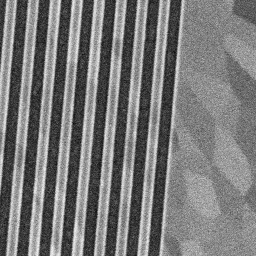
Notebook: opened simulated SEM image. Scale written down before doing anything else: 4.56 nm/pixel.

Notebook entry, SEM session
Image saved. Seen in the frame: parallel lines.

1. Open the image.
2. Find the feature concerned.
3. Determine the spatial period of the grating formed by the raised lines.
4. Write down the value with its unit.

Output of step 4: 0.0993 microns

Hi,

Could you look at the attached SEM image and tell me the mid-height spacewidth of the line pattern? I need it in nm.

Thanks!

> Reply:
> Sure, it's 56.2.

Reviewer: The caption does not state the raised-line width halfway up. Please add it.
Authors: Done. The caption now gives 43.1 nm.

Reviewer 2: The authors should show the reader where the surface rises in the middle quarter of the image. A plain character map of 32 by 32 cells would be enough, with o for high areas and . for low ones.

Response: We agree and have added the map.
.oo...ooo...oo...oo....oo...oooo
.oo...oo....oo...oo....oo...oooo
.oo...oo....oo...oo....oo...oooo
.oo...oo....oo...oo....oo...oooo
ooo...oo...ooo...oo...oo....oooo
ooo...oo...ooo...oo...oo....oooo
ooo...oo...ooo...oo...oo....oooo
oo....oo...oo....oo...oo....oooo
oo....oo...oo....oo...oo....oooo
oo....oo...oo....o....oo....oooo
oo...ooo...oo...oo....oo...ooooo
oo...ooo...oo...oo....oo...ooooo
oo...oo....oo...oo....oo...ooooo
oo...oo....oo...oo....oo...ooooo
oo...oo....oo...oo....oo...ooooo
oo...oo....oo...oo...oo....ooooo
oo...oo...ooo...oo...oo....ooooo
oo...oo...ooo...oo...oo....ooooo
o....oo...oo....oo...oo....ooooo
o....oo...oo....oo...oo....ooooo
o....oo...oo....oo...oo....ooooo
o...ooo...oo...oo....oo...oooooo
o...ooo...oo...oo....oo...oooooo
o...ooo...oo...oo....oo...oooooo
o...oo....oo...oo....oo...oooooo
o...oo....oo...oo....oo...oooooo
o...oo....oo...oo....o....oooooo
o...oo...ooo...oo...oo....oooooo
o...oo...ooo...oo...oo....oooooo
o...oo...oo....oo...oo....oooooo
....oo...oo....oo...oo....oooooo
....oo...oo....oo...oo....oooooo